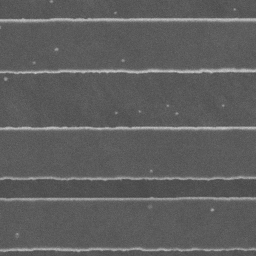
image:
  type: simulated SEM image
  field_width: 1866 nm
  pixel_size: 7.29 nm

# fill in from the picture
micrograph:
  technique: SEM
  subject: lines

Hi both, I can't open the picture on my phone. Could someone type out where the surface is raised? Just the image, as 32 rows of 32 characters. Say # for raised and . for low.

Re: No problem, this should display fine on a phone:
................................
................................
################################
################################
################################
################################
################################
################################
################################
................................
................................
................................
................................
................................
................................
................................
################################
################################
################################
################################
################################
################################
................................
................................
................................
################################
################################
################################
################################
################################
################################
................................